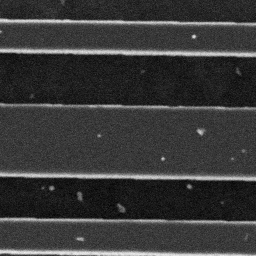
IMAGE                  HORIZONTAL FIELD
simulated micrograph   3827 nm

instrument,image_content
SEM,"lines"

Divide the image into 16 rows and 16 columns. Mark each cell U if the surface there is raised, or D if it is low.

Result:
DDDDDDDDDDDDDDDD
UUUUUUUUUUUUUUUU
UUUUUUUUUUUUUUUU
DDDDDDDDDDDDDDDD
DDDDDDDDDDDDDDDD
DDDDDDDDDDDDDDDD
UDDDDDDDDDDDDDDD
UUUUUUUUUUUUUUUU
UUUUUUUUUUUUUUUU
UUUUUUUUUUUUUUUU
UUUUUUUUUUUUUUUU
DDDDDDDDDDDDDDDD
DDDDDDDDDDDDDDDD
DDDDDDDDDDDDDDDD
UUUUUUUUUUUUUUUU
UUUUUUUUUUUUUUUU